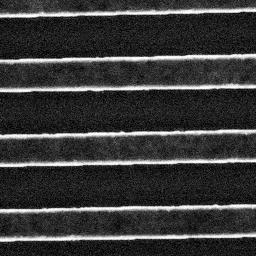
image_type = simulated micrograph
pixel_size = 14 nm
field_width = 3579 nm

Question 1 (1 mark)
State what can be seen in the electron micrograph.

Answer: lines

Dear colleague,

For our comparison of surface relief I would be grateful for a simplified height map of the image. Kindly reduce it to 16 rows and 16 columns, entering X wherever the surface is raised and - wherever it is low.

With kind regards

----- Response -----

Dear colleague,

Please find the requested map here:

XXXXXXXXXXXXXXXX
----------------
----------------
-------------XXX
XXXXXXXXXXXXXXXX
XXXXXXXXXXXXX---
----------------
----------------
-XXXXXXXXXXXXXXX
XXXXXXXXXXXXXXXX
----------------
----------------
----------------
XXXXXXXXXXXXXXXX
XXXXXXXXXXXXXXXX
----------------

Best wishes